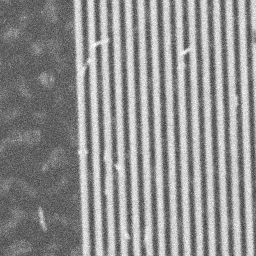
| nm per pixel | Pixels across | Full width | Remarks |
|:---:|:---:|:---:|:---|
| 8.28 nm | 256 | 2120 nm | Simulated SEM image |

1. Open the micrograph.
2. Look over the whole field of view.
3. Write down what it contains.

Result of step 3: parallel lines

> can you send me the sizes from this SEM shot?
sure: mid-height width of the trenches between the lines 56.9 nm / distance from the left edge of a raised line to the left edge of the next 104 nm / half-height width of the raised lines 43.4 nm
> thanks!